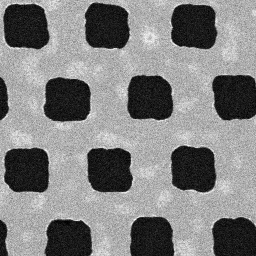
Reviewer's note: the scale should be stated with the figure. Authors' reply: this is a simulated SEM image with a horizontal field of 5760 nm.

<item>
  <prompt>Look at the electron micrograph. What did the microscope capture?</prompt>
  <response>a regular array of holes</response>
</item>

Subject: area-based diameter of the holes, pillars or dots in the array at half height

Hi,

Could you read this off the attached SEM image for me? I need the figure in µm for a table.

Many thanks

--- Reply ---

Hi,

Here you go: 1.08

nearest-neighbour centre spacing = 1830 nanometres